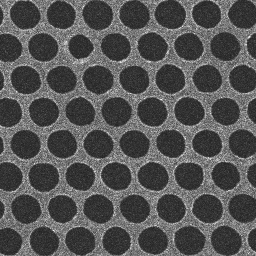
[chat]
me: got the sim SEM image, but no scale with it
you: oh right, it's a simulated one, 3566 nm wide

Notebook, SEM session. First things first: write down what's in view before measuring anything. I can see a regular array of holes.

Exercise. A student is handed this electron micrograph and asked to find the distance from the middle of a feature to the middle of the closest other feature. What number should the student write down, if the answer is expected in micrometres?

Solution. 0.506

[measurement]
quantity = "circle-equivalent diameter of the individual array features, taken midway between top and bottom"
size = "0.41 micrometres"